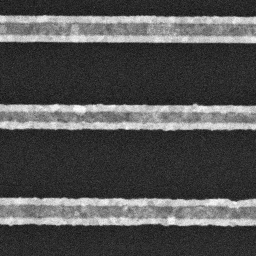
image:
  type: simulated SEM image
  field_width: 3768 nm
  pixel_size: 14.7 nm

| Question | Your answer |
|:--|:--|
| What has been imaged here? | one or a few lines or trenches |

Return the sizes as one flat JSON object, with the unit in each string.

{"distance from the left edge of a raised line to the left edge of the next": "1.34 um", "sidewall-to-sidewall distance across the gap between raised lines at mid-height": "1060 nm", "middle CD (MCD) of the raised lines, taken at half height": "0.282 µm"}